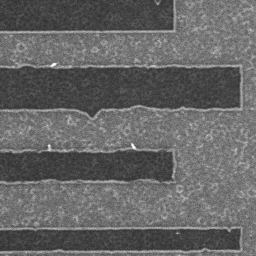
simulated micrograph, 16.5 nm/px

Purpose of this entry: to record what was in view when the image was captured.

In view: one or a few lines or trenches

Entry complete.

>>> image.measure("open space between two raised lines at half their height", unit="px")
40.2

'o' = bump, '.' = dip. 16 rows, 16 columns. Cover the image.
ooooooooooo.....
ooooooooooo.....
................
................
ooooooooooooooo.
ooooooooooooooo.
ooooooooooooooo.
................
................
ooooooooooo.....
ooooooooooo.....
................
................
................
ooooooooooooooo.
ooooooooooooooo.